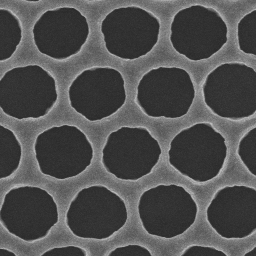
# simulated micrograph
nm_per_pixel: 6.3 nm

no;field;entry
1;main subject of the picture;a regular array of holes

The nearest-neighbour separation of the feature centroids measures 427 nanometers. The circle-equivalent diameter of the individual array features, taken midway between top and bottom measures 55.1 pixels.